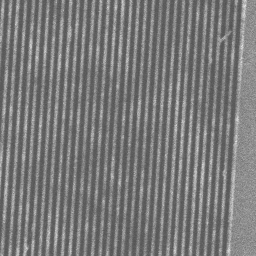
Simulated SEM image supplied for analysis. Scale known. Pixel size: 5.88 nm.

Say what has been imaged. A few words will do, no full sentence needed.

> parallel lines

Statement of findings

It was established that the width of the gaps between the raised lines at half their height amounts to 26.4 nm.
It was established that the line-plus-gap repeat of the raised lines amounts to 44.1 nanometres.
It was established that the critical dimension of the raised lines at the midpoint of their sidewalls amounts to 20.5 nm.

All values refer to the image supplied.